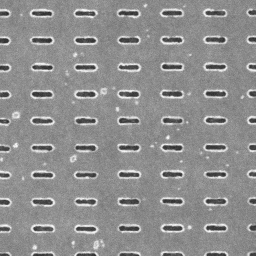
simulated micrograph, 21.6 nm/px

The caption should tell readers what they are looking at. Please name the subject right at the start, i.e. a regular array of holes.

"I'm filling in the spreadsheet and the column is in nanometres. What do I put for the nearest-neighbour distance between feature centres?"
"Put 576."